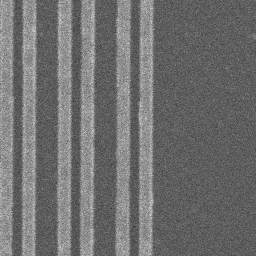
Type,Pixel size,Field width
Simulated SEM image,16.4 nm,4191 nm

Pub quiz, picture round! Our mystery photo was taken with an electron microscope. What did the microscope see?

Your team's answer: parallel lines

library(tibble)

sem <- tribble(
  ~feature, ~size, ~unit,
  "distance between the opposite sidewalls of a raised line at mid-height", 184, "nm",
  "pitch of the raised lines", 463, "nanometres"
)